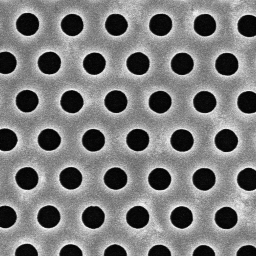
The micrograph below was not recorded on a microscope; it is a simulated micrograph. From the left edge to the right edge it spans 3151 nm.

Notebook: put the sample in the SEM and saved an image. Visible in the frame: a regular array of holes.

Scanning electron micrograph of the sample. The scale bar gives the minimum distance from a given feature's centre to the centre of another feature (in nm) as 542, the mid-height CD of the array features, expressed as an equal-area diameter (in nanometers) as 286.